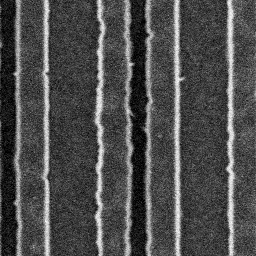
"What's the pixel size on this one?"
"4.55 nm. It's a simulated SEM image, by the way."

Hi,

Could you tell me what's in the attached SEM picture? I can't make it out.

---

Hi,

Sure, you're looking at one or a few lines or trenches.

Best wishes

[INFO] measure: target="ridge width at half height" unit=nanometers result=139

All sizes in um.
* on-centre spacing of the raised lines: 0.297